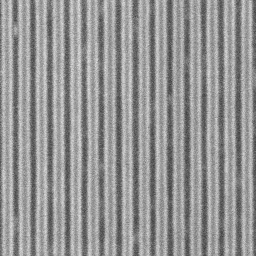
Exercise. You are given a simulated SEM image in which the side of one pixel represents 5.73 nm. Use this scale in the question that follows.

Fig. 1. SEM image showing parallel lines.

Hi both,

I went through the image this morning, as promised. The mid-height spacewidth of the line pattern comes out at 45.8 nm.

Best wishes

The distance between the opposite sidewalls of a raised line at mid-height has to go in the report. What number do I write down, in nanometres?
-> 51.5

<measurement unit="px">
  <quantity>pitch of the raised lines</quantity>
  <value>17.1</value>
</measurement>